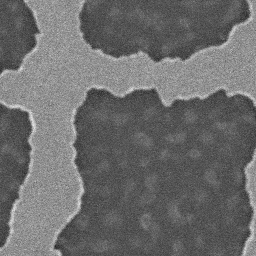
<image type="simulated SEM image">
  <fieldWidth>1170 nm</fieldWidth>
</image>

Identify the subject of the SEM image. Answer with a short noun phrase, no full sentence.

holes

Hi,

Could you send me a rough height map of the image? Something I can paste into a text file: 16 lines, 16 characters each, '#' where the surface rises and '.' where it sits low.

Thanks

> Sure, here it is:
..###...........
..###..........#
..###.........##
..#####.#...####
################
################
#####...........
..###...........
..###...........
..###...........
..###..........#
.####..........#
.####...........
.####...........
.###............
####...........#